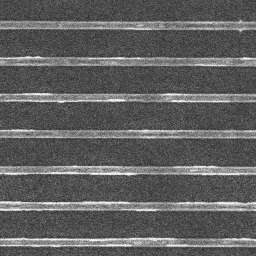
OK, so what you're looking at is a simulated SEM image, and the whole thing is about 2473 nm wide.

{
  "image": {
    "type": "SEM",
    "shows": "parallel lines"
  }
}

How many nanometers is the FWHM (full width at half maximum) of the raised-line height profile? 73.7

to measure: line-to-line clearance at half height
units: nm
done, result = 275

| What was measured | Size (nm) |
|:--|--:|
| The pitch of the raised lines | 349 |